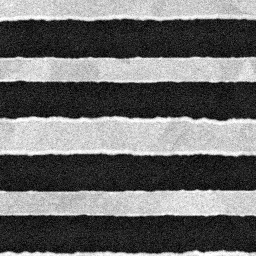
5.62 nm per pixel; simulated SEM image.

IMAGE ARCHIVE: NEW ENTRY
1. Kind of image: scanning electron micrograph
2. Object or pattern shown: lines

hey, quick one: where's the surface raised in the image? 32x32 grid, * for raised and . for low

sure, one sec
********************************
********************************
**.........*....................
................................
................................
................................
................................
********************************
********************************
********************************
................................
................................
................................
................................
................................
********************************
********************************
********************************
********************************
................................
................................
................................
................................
................................
********************************
********************************
********************************
................................
................................
................................
................................
........................*..***..